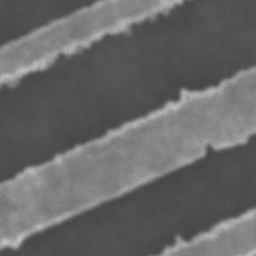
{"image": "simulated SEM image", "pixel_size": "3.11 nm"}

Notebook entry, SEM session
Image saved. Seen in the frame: one or a few lines or trenches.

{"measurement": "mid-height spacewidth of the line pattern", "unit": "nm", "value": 281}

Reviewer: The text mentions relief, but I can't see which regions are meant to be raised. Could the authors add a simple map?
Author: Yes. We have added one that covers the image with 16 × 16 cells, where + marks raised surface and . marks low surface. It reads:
.....+++++......
...+++++........
.+++++..........
+++.............
++.............+
.............+++
...........+++++
.........+++++++
.......+++++++++
....+++++++++...
..+++++++++.....
+++++++++.......
+++++++.........
++++...........+
++...........+++
...........+++++